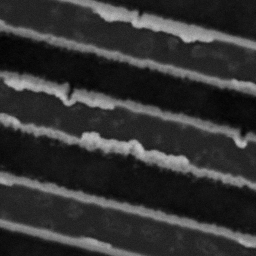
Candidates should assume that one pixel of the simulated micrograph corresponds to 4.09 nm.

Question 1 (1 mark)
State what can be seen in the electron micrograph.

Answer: one or a few lines or trenches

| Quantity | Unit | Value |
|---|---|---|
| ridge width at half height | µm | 0.194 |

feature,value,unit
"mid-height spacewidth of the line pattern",199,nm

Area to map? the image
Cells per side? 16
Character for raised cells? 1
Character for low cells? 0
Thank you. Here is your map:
1111111000000000
1111111111100000
0001111111111110
0000000111111111
0000000000011111
1111000000000001
1111111100000000
1111111111110000
0000111111111110
0000000011111111
0000000000011111
1100000000000001
1111110000000000
1111111111000000
0011111111111100
0000001111111111